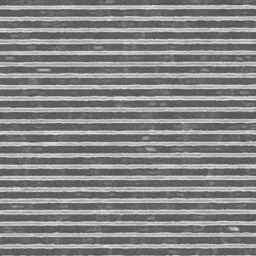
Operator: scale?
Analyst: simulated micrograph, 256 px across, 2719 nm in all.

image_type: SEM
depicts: parallel lines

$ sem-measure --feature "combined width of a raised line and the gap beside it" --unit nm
121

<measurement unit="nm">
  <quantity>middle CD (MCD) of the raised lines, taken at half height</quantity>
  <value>30.5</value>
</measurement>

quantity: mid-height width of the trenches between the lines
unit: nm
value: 88.9